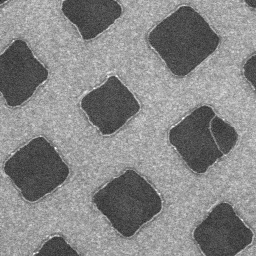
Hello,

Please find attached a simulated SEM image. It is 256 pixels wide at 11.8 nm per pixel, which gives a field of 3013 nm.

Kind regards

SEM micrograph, raised bodies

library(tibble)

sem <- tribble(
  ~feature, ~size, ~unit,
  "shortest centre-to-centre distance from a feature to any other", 1150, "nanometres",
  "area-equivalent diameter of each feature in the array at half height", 722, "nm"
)